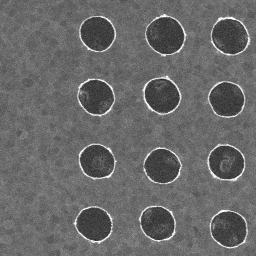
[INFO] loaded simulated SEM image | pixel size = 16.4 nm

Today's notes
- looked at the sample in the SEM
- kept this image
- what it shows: a regular array of holes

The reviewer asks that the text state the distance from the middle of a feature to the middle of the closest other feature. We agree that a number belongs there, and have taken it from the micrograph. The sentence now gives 62.7 px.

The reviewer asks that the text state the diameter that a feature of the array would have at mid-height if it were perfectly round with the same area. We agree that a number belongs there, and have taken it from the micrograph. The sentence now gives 582 nm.